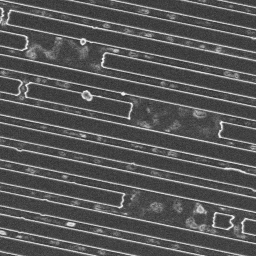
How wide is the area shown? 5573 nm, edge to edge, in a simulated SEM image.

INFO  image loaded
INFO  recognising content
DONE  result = parallel lines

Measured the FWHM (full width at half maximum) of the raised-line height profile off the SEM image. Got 15.2 px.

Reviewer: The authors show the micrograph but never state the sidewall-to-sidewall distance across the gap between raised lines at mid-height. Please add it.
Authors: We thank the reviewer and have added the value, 157 nm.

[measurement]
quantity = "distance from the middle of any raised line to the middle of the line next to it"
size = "486 nm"